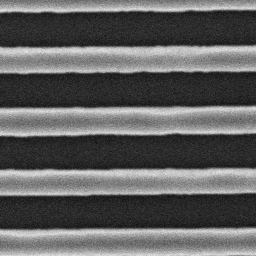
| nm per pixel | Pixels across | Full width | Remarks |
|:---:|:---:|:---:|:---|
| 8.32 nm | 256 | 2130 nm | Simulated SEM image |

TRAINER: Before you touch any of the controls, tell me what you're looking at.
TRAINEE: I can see lines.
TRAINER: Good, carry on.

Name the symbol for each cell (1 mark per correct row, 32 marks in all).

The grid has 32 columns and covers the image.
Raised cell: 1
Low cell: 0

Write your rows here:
11111111111111111111111111111111
10001001000000000000000000000000
00000000000000000000000000000000
00000000000000000000000000000000
00000000000000000000000000000000
00000000000000000000000000000000
11111111111111111111111111111111
11111111111111111111111111111111
11111111111111111111111111111111
00000000000000000000000000000000
00000000000000000000000000000000
00000000000000000000000000000000
00000000000000000000000000000000
00000000000000000000000000111111
11111111111111111111111111111111
11111111111111111111111111111111
11111111111111111111111111111111
00000000000000000000000000000000
00000000000000000000000000000000
00000000000000000000000000000000
00000000000000000000000000000000
11111111111111111111111111111111
11111111111111111111111111111111
11111111111111111111111111111111
00000000000000000000000000000000
00000000000000000000000000000000
00000000000000000000000000000000
00000000000000000000000000000000
00000000000000000000000000000000
11111111111111111111111111111111
11111111111111111111111111111111
11111111111111111111111111111111